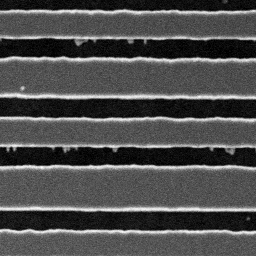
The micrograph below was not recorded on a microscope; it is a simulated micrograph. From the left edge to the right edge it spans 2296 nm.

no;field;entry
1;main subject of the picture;lines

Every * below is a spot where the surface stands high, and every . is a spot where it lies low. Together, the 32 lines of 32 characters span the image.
................................
**************************.*****
********************************
********************************
********************************
................................
................................
********************************
********************************
********************************
********************************
********************************
................................
................................
................................
********************************
********************************
********************************
................................
................................
................................
********************************
********************************
********************************
********************************
********************************
................................
................................
................................
********************************
********************************
********************************